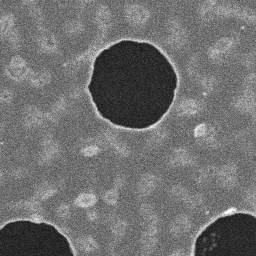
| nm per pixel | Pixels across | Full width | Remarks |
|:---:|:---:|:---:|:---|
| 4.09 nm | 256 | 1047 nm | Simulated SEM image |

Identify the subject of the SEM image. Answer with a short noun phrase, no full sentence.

holes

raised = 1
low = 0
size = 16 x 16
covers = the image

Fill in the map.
1111111111111111
1111111111111111
1111111111111111
1111110000111111
1111110000011111
1111110000011111
1111110000011111
1111111000111111
1111111111111111
1111111111111111
1111111111111111
1111111111111111
1111111111111111
1111111111111100
0000111111111000
0000111111110000